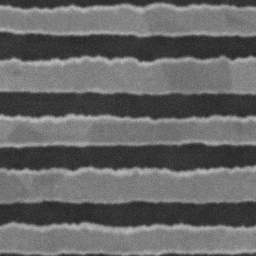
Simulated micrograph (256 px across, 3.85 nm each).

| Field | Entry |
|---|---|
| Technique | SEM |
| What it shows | lines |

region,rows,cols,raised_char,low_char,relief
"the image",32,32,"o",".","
................................
oooooooooooooooooooooooooooooooo
oooooooooooooooooooooooooooooooo
oooooooooooooooooooooooooooooooo
.....................o..........
................................
................................
.o.....oooooooooo...ooooo.oooooo
oooooooooooooooooooooooooooooooo
oooooooooooooooooooooooooooooooo
oooooooooooooooooooooooooooooooo
............ooo.oooooooooooooooo
................................
................................
........oo...o..................
oooooooooooooooooooooooooooooooo
oooooooooooooooooooooooooooooooo
oooooooooooooooooooooooooooooooo
................................
................................
................................
oooooooooooooooooooooo.ooooooooo
oooooooooooooooooooooooooooooooo
oooooooooooooooooooooooooooooooo
oooooooooooooooooooooooooooooooo
................................
................................
................................
oooooooooooooo..oooooooooooooooo
oooooooooooooooooooooooooooooooo
oooooooooooooooooooooooooooooooo
oooooooooooooooooooooooooooooooo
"